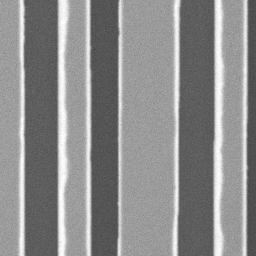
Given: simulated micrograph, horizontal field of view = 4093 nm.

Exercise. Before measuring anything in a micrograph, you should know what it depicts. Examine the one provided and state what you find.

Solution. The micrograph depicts lines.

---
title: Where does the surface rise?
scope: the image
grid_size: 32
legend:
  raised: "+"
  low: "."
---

+++.....+++....+++++++.....++++.
+++.....+++....+++++++.....++++.
+++....++++....+++++++.....++++.
+++.....+++....+++++++.....++++.
+++.....+++....+++++++.....++++.
+++....++++....+++++++.....++++.
+++....++++....+++++++.....++++.
+++....++++....+++++++.....++++.
+++....++++....+++++++.....++++.
+++....++++....+++++++.....++++.
+++....++++....+++++++.....++++.
+++....++++....+++++++.....++++.
+++....++++....+++++++.....++++.
+++....++++....+++++++.....++++.
+++....++++....+++++++.....++++.
+++....++++....+++++++.....++++.
+++.....+++....+++++++.....++++.
+++....++++....+++++++.....++++.
+++....++++....+++++++.....++++.
+++....++++....+++++++.....++++.
+++.....+++....+++++++.....++++.
+++.....+++....+++++++.....++++.
+++....++++....+++++++.....++++.
+++....++++....+++++++.....++++.
+++....++++....+++++++.....++++.
+++....++++....+++++++.....++++.
+++....++++....+++++++.....++++.
+++....++++....+++++++.....++++.
+++....++++....+++++++.....++++.
+++....++++....+++++++.....++++.
+++....++++....+++++++.....++++.
+++....++++....+++++++.....++++.